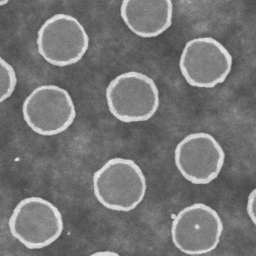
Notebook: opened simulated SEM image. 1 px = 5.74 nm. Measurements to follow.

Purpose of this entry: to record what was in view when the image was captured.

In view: a regular array of raised bodies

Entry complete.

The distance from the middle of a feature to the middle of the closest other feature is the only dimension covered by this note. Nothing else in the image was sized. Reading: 435 nanometres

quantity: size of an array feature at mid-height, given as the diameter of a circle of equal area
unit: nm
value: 276